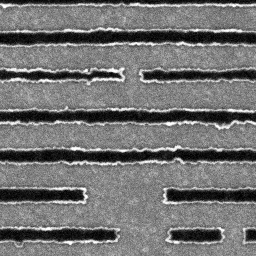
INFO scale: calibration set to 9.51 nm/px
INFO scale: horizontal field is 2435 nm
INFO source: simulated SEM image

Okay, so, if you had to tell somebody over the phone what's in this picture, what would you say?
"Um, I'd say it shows parallel lines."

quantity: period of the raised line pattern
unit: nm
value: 376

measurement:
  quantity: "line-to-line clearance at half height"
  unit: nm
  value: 238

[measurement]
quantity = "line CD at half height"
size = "138 nm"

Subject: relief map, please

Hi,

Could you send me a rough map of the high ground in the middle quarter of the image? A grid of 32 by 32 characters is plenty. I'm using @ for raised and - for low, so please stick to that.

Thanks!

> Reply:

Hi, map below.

--------------------------------
@--@-@-@@@@@@-@-------@@@-@@@@@@
@@@@@@@@@@@@@@@----@@@@@@@@@@@@@
@@@@@@@@@@@@@@@----@@@@@@@@@@@@@
------@-------------@@-@@@@-----
--------------------------------
--------------------------------
--------------------------------
--------------------------------
--------------------------------
--------------------------------
@--@@--@@@@@@@@@@@@@@-@---@@@@@@
@@@@@@@@@@@@@@@@@@@@@@@@@@@@@@@@
@@@@@@@@@@@@@@@@@@@@@@@@@@@@@@@@
@@@@@@@@@@@@@@@@@@@@@@@@@@@@@@@@
--------------------------------
--------------------------------
--------------------------------
--------------------------------
--------------------------------
--------------------------------
@@@@@@@@@@@@-@--@@@@@@@@@@@@@@@@
@@@@@@@@@@@@@@@@@@@@@@@@@@@@@@@@
@@@@@@@@@@@@@@@@@@@@@@@@@@@@@@@@
@@@@@@@@@@@@@@@@@@@@@@-@@@@--@@@
--------------------------------
--------------------------------
--------------------------------
--------------------------------
--------------------------------
--------------------------------
@@@@@--------------------@@@@@@@